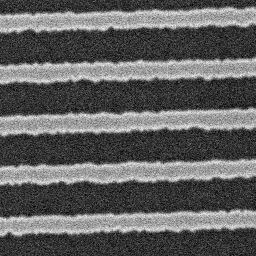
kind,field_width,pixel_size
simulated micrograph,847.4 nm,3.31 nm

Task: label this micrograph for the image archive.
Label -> lines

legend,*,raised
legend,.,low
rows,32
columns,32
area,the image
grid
................................
..............*..***************
********************************
**************.**...............
................................
................................
................................
...............................*
********************************
******************************..
................................
................................
................................
................................
.....**.************************
********************************
********........................
................................
................................
................................
...............*****************
********************************
****************.***.*..........
................................
................................
................................
...........................*.***
********************************
****************************.*..
................................
................................
................................